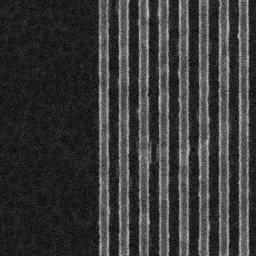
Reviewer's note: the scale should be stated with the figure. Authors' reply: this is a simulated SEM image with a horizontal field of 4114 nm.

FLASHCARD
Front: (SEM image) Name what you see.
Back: parallel lines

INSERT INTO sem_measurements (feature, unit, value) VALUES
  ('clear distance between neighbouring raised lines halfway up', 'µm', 0.173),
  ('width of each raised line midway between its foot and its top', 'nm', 143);